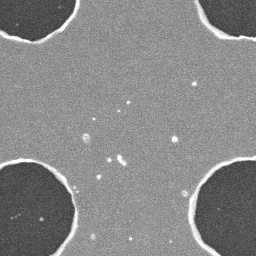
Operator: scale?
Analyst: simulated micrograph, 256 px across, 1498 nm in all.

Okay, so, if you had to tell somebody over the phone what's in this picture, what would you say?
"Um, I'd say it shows holes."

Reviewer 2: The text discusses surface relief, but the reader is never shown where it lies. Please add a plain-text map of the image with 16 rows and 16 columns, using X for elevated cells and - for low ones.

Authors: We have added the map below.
-----XXXXXXX----
----XXXXXXXXX---
XX-XXXXXXXXXXXXX
XXXXXXXXXXXXXXXX
XXXXXXXXXXXXXXXX
XXXXXXXXXXXXXXXX
XXXXXXXXXXXXXXXX
XXXXXXXXXXXXXXXX
XXXXXXXXXXXXXXXX
XXXXXXXXXXXXXXXX
---XXXXXXXXXXX--
----XXXXXXXXX---
----XXXXXXXX----
-----XXXXXXX----
----XXXXXXXX----
----XXXXXXXXX---